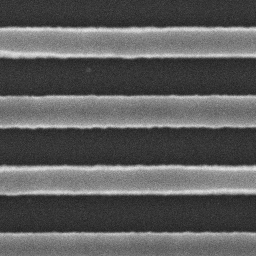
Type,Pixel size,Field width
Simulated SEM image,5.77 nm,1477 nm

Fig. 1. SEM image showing lines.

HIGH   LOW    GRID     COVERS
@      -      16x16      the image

----------------
----------------
@@@@@@@@@@@@@@@@
-@@@@@@@@@@@@@@@
----------------
----------------
@@@@@@@@@@@@@@@@
@@@@@@@@@@@@@@@@
----------------
----------------
@-@@@@@@@@@@@@@@
@@@@@@@@@@@@@@@@
----------------
----------------
----------------
@@@@@@@@@@@@@@@@